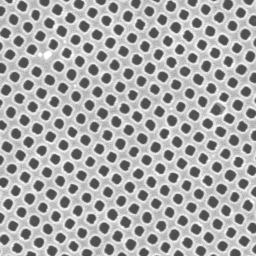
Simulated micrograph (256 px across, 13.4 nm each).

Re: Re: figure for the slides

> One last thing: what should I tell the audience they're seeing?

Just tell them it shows a regular array of holes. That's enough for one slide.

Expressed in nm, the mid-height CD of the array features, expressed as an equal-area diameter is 142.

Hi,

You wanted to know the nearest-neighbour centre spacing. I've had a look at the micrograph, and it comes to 206 nanometres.